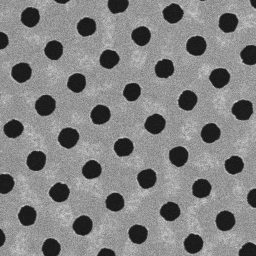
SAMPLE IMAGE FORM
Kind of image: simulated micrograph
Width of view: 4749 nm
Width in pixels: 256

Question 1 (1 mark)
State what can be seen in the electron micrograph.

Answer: a regular array of holes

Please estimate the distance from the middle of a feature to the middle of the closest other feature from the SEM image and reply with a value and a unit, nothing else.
728 nm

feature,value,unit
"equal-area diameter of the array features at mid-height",368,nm